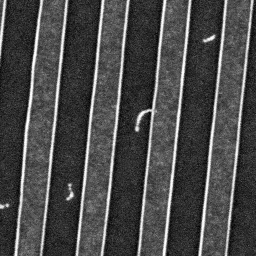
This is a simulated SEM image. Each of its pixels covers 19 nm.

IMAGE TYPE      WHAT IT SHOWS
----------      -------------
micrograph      one or a few lines or trenches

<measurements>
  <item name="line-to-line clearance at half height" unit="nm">681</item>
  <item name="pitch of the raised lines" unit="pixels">61.4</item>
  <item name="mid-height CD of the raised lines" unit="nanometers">485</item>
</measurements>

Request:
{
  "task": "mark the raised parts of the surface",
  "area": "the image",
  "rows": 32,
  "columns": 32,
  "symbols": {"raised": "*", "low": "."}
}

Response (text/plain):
*....***.....***.....***....***.
.....***.....***....****....***.
.....***.....***....***.....***.
.....***.....***....***.....***.
.....***....***.....***.....***.
.....***....***.....***.....***.
....****....***.....***.....***.
....****....***.....***....****.
....***.....***.....***....****.
....***.....***.....***....****.
....***.....***.....***....***..
....***.....***....****....***..
....***.....***....****....***..
....***.....***....***.....***..
....***....****....***.....***..
...****....****....***.....***..
...****....***.....***.....***..
...****....***.....***....****..
...***.....***.....***....****..
...***.....***.....***....****..
...***.....***....****....***...
...***.....***....****....***...
...***.....***....***.....***...
...***....****....***.....***...
...***....****....***.....***...
...***....***.....***.....***...
..****....***.....***.....***...
..****....***.....***....****...
..***.....***.....***....****...
..***.....***.....***....****...
..***.....***....****....***....
..***.....***....***.....***....